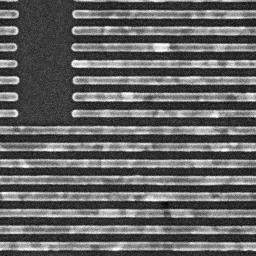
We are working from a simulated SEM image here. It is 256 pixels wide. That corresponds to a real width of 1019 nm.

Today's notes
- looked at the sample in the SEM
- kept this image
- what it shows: parallel lines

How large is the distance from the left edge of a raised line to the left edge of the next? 66 nanometers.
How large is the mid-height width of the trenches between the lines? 9.15 pixels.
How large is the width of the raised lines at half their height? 28.9 nanometres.